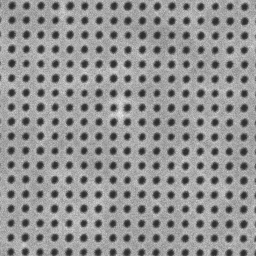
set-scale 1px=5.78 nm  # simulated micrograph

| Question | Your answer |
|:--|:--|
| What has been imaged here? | a regular array of holes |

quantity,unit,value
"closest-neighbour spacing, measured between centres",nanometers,81.3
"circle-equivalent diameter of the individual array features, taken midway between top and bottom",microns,0.0461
